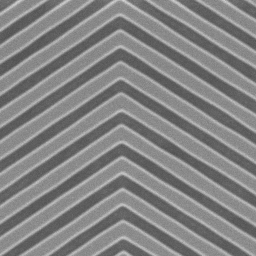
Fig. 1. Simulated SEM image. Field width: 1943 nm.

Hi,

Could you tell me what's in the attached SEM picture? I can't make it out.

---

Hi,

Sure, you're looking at groups of lines, slits or small figures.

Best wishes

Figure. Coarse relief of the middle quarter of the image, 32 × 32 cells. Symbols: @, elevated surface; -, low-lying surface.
@@@@@@@-----@@@@------@@@@@@@---
@@@@@------@@@@@@@-----@@@@@@@@-
@@@@-----@@@@@@@@@@@-----@@@@@@@
@@------@@@@@@@@@@@@@-----@@@@@@
@-----@@@@@@@---@@@@@@@-----@@@@
----@@@@@@@------@@@@@@@------@@
---@@@@@@@---------@@@@@@@-----@
--@@@@@@------@-----@@@@@@@-----
@@@@@@@-----@@@@@-----@@@@@@@---
@@@@@-----@@@@@@@@------@@@@@@@-
@@@@-----@@@@@@@@@@@-----@@@@@@@
@@@-----@@@@@@@@@@@@@------@@@@@
@-----@@@@@@@---@@@@@@@-----@@@@
-----@@@@@@-------@@@@@@------@@
---@@@@@@@---------@@@@@@@------
--@@@@@@------@------@@@@@@@----
@@@@@@@-----@@@@@-----@@@@@@@---
@@@@@------@@@@@@@------@@@@@@@-
@@@@-----@@@@@@@@@@@------@@@@@@
@@------@@@@@@@@@@@@@------@@@@@
@-----@@@@@@@---@@@@@@@-----@@@@
-----@@@@@@-------@@@@@@------@@
---@@@@@@@---------@@@@@@@------
--@@@@@@------@------@@@@@@@----
@@@@@@@-----@@@@@------@@@@@@@--
@@@@@------@@@@@@@------@@@@@@@-
@@@@-----@@@@@@@@@@@------@@@@@@
@@------@@@@@@-@@@@@@------@@@@@
@-----@@@@@@@---@@@@@@@------@@@
-----@@@@@@-------@@@@@@@-----@@
---@@@@@@@----------@@@@@@------
--@@@@@@------@@-----@@@@@@@----